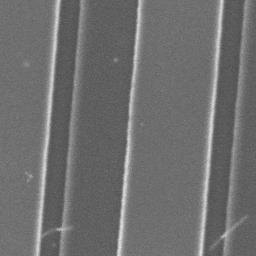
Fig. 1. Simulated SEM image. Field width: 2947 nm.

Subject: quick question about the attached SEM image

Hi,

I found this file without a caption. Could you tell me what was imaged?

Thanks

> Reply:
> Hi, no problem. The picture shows lines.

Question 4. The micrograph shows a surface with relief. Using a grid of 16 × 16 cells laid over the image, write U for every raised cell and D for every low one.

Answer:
UUUUDDDDDUUUUUDD
UUUUDDDDDUUUUUDD
UUUDDDDDDUUUUUDD
UUUDDDDDUUUUUUDD
UUUDDDDDUUUUUUDD
UUUDDDDDUUUUUDDD
UUUDDDDDUUUUUDDD
UUUDDDDDUUUUUDDD
UUUDDDDDUUUUUDDD
UUUDDDDDUUUUUDDD
UUUDDDDDUUUUUDDD
UUUDDDDDUUUUUDDD
UUUDDDDDUUUUUDDD
UUUDDDDDUUUUUDDD
UUUDDDDUUUUUUDDD
UUDDDDDUUUUUUDDD